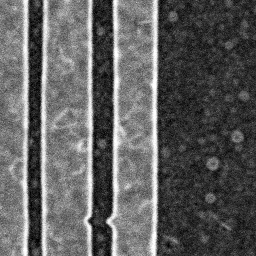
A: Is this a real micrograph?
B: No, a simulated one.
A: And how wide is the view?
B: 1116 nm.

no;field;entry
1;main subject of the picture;one or a few lines or trenches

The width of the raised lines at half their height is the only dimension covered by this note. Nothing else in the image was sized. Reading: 196 nm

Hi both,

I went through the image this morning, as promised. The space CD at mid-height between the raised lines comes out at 83.9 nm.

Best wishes